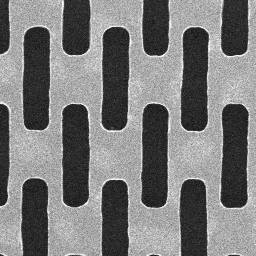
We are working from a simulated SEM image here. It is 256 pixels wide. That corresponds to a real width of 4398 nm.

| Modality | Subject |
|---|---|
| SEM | holes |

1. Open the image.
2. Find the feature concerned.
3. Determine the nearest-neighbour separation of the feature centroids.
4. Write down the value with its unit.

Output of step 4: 1360 nm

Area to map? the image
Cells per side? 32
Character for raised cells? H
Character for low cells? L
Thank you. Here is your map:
LHHHHHHHLLLHHHHHHHLLLHHHHHHHLLLH
LHHHHHHHLLLHHHHHHHLLLHHHHHHHLLLH
LHHHHHHHLLLHHHHHHHLLLHHHHHHHLLLH
LHHHLLHHLLLHHHLHHHLLLHHHLHHHLLLH
LHHLLLHHLLLHHLLLHHLLLHHLLLHHLLLH
LHHLLLHHLLLHHLLLHHLLLHHLLLHHLLLH
LHHLLLHHLLLHHLLLHHLLLHHLLLHHLLLH
HHHLLLHHHHHHHLLLHHHHHHHLLLHHHHHH
HHHLLLHHHHHHHLLLHHHHHHHLLLHHHHHH
HHHLLLHHHHHHHLLLHHHHHHHLLLHHHHHH
HHHLLLHHHHHHHLLLHHHHHHHLLLHHHHHH
HHHLLLHHHHHHHLLLHHHHHHHLLLHHHHHH
HHHLLLHHHHHHHLLLHHHHHHHLLLHHHHHH
LHHLLLHHLLLHHLLLHHLLLHHLLLHHLLLH
LHHLLLHHLLLHHLLLHHLLLHHLLLHHLLLH
LHHLLLHHLLLHHLLLHHLLLHHLLLHHLLLH
LHHHHHHHLLLHHHHHHHLLLHHHHHHHLLLH
LHHHHHHHLLLHHHHHHHLLLHHHHHHHLLLH
LHHHHHHHLLLHHHHHHHLLLHHHHHHHLLLH
LHHHHHHHLLLHHHHHHHLLLHHHHHHHLLLH
LHHHHHHHLLLHHHHHHHLLLHHHHHHHLLLH
LHHHHHHHLLLHHHHHHHLLLHHHHHHHLLLH
LHHLLHHHLLLHHHLHHHLLLHHLLHHHLLLH
LHHLLLHHLLLHHLLLHHLLLHHLLLHHLLLH
LHHLLLHHLLLHHLLLHHLLLHHLLLHHLLLH
LHHLLLHHLLHHHLLLHHLLLHLLLLHHLLLH
HHHLLLHHHHHHHLLLHHHHHHLLLLHHHHHH
HHHLLLHHHHHHHLLLHHHHHHLLLLHHHHHH
HHHLLLHHHHHHHLLLHHHHHHLLLLHHHHHH
HHHLLLHHHHHHHLLLHHHHHHHLLLHHHHHH
HHHLLLHHHHHHHLLLHHHHHHHLLLHHHHHH
HHHLLLHHHHHHHLLLHHHHHHHLLLHHHHHH